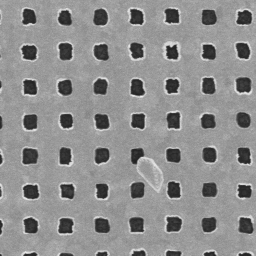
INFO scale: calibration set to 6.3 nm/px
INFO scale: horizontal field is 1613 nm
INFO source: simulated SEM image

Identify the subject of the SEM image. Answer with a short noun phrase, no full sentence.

a regular array of holes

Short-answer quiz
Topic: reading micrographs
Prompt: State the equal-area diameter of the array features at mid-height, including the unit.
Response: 99.3 nm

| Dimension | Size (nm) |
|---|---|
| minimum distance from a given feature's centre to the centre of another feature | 216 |